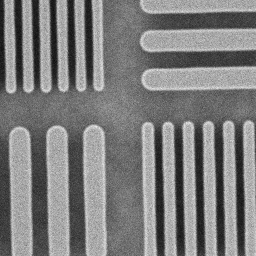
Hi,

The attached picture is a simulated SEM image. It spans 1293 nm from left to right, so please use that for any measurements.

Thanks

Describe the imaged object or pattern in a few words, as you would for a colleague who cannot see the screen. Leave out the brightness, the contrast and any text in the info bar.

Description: groups of lines, slits or small figures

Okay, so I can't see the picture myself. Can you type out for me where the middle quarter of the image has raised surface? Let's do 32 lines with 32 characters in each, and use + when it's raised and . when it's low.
+..++..+++......................
+..++..+++...........+++++++++++
+..++..+++..........++++++++++++
+..++..+++..........++++++++++++
+..++..+++..........++++++++++++
+..++..+++..........++++++++++++
+...+...+.......................
................................
................................
................................
................................
................................
................................
................................
................................
.......+............++...++...++
.....+++++..........++...++...++
+....+++++..........++...++...++
+....+++++..........++...++...++
+....+++++..........++...++...++
+....+++++..........++...++...++
+....+++++..........+++..+++..++
+....+++++..........+++..+++..++
+....+++++..........+++..+++..++
+....+++++..........+++..+++..++
+....+++++..........+++..+++..++
+....+++++..........+++..+++..++
+....+++++..........+++..+++..++
+....+++++..........+++..+++..++
+....+++++..........+++..+++..++
+....+++++..........+++..+++..++
+....+++++..........+++..+++..++